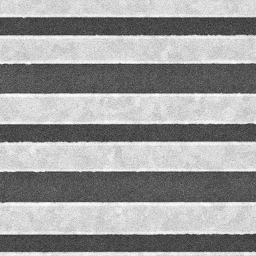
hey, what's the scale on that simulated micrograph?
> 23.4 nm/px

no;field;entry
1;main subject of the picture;lines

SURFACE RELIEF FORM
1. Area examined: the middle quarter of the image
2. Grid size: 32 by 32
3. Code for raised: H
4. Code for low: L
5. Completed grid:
LLLLLLLLLLLLLLLLLLLLLLLLLLLLLLLL
LLLLLLLLLLLLLLLLLLLLLLLLLLLLLLLL
LLLLLLLLLLLLLLLLLLLLLLLLLLLLLLLL
LLLLLLLLLLLLLLLLLLLLLLLLLLLLLLLL
LLLLLLLLLLLLLLLLLLLLLLLLLLLLLLLL
LLLLLLLLLLLLLLLLLLLLLLLLLLLLLLLL
LLLLLLLLLLLLLLLLLLLLLLLLLLLLLLLL
LLLLLLLLLLLLLLLLLLLLLLLLLLLLLLLL
HHHHHHHHHHHHHHHHHHHHHHHHHHHHHHHH
HHHHHHHHHHHHHHHHHHHHHHHHHHHHHHHH
HHHHHHHHHHHHHHHHHHHHHHHHHHHHHHHH
HHHHHHHHHHHHHHHHHHHHHHHHHHHHHHHH
HHHHHHHHHHHHHHHHHHHHHHHHHHHHHHHH
HHHHHHHHHHHHHHHHHHHHHHHHHHHHHHHH
HHHHHHHHHHHHHHHHHHHHHHHHHHHHHHHH
LLLLLLLLLLLLLLLLLLLLLLLLLLLLLLLL
LLLLLLLLLLLLLLLLLLLLLLLLLLLLLLLL
LLLLLLLLLLLLLLLLLLLLLLLLLLLLLLLL
LLLLLLLLLLLLLLLLLLLLLLLLLLLLLLLL
LLLLLLLLLLLLLLLLLLLLLLLLLLLLLLLL
HHHHHHHHHHHHHHHHHHHHHHHHHHHHHHHH
HHHHHHHHHHHHHHHHHHHHHHHHHHHHHHHH
HHHHHHHHHHHHHHHHHHHHHHHHHHHHHHHH
HHHHHHHHHHHHHHHHHHHHHHHHHHHHHHHH
HHHHHHHHHHHHHHHHHHHHHHHHHHHHHHHH
HHHHHHHHHHHHHHHHHHHHHHHHHHHHHHHH
HHHHHHHHHHHHHHHHHHHHHHHHHHHHHHHH
LLLLLLLLLLLLLLLLLLLLLLLLLLLLLLLL
LLLLLLLLLLLLLLLLLLLLLLLLLLLLLLLL
LLLLLLLLLLLLLLLLLLLLLLLLLLLLLLLL
LLLLLLLLLLLLLLLLLLLLLLLLLLLLLLLL
LLLLLLLLLLLLLLLLLLLLLLLLLLLLLLLL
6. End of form